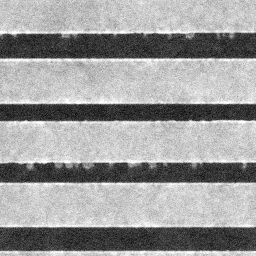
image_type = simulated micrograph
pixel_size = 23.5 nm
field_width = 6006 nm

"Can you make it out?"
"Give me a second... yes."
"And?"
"lines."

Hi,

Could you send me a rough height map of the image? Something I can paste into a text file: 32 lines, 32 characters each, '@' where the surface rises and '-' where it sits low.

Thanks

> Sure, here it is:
@@@@@@@@@@@@@@@@@@@@@@@@@@@@@@@@
@@@@@@@@@@@@@@@@@@@@@@@@@@@@@@@@
@@@@@@@@@@@@@@@@@@@@@@@@@@@@@@@@
@@@@@@@@@@@@@@@@@@@@@@@@@@@@@@@@
--------------------------------
--------------------------------
--------------------------------
@@@@@@@@@@@@@@@@@@@@@@@@@@@@@@@@
@@@@@@@@@@@@@@@@@@@@@@@@@@@@@@@@
@@@@@@@@@@@@@@@@@@@@@@@@@@@@@@@@
@@@@@@@@@@@@@@@@@@@@@@@@@@@@@@@@
@@@@@@@@@@@@@@@@@@@@@@@@@@@@@@@@
@@@@@@@@@@@@@@@@@@@@@@@@@@@@@@@@
--------------------------------
--------------------------------
@@@@@@@@@@@@@@@@@@@@@@@@@@@@@@@@
@@@@@@@@@@@@@@@@@@@@@@@@@@@@@@@@
@@@@@@@@@@@@@@@@@@@@@@@@@@@@@@@@
@@@@@@@@@@@@@@@@@@@@@@@@@@@@@@@@
@@@@@@@@@@@@@@@@@@@@@@@@@@@@@@@@
--------------------------------
--------------------------------
--------------------------------
@@@@@@@@@@@@@@@@@@@@@@@@@@@@@@@@
@@@@@@@@@@@@@@@@@@@@@@@@@@@@@@@@
@@@@@@@@@@@@@@@@@@@@@@@@@@@@@@@@
@@@@@@@@@@@@@@@@@@@@@@@@@@@@@@@@
@@@@@@@@@@@@@@@@@@@@@@@@@@@@@@@@
--------------------------------
--------------------------------
--------------------------------
@@@@@@@@@@@@@@@@@@@@@@@@@@@@@@@@